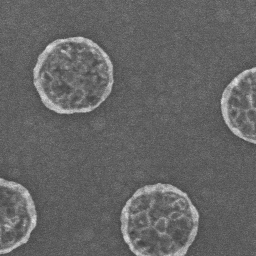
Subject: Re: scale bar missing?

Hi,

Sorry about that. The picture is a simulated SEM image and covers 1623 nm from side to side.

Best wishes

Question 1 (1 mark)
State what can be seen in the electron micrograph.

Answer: raised bodies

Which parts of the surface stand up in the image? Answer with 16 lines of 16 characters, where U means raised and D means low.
DDDDDDDDDDDDDDDD
DDDDDDDDDDDDDDDD
DDDDDDDDDDDDDDDD
DDDUUUUDDDDDDDDD
DDUUUUUDDDDDDDDU
DDUUUUUDDDDDDDUU
DDDUUUDDDDDDDDUU
DDDDDDDDDDDDDDUU
DDDDDDDDDDDDDDDU
DDDDDDDDDDDDDDDD
DDDDDDDDDDDDDDDD
UDDDDDDDDDDDDDDD
UUDDDDDDUUUUDDDD
UUDDDDDDUUUUDDDD
UUDDDDDDUUUUDDDD
UDDDDDDDUUUUDDDD